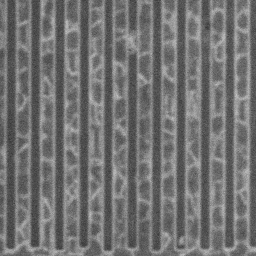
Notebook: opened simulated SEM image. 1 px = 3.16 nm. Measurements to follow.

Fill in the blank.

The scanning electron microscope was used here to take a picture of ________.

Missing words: parallel lines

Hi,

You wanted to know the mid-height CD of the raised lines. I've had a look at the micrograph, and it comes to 42.7 nm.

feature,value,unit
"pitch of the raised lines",76.9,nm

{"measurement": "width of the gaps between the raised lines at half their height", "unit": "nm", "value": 34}